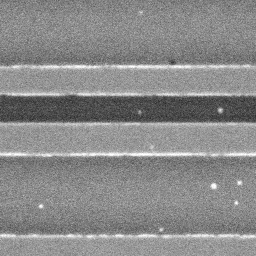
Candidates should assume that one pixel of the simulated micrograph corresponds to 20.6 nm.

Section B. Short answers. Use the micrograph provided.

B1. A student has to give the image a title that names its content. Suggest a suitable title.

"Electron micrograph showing lines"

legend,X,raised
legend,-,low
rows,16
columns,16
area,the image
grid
----------------
----------------
----------------
----------------
XXXXXXXXXXXXXXXX
XXXXXXXXXXXXXXXX
----------------
----------------
XXXXXXXXXXXXXXXX
XXXXXXXXXXXXXXXX
----------------
----------------
----------------
----------------
----------------
XXXXXXXXXXXXXXXX